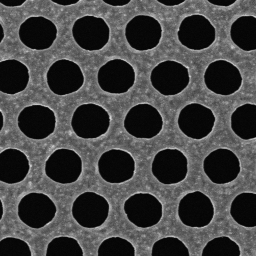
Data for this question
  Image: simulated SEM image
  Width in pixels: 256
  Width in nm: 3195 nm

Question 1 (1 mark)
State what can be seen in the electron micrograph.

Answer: a regular array of holes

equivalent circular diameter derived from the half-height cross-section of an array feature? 454 nanometres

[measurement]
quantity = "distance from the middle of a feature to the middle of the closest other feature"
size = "633 nm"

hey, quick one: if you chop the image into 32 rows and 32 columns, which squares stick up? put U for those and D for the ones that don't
DDDUUUUDDUUUUUDDUUUUDDUUUUUDDUUU
UUUUUUUUUUUUUUUUUUUUUUUUUUUUUUUU
UUUDDDUUUUDDDUUUDDDDUUUDDDUUUUDD
UUDDDDDUUDDDDDUUDDDDUUDDDDDUUDDD
DUDDDDDUUDDDDDUUDDDDUUDDDDDUUDDD
UUUDDDDUUUDDDUUUDDDDUUUDDDUUUDDD
UUUUUUUUUUUUUUUUUUUUUUUUUUUUUUUU
UDUUUUUDUUUUUUDUUUUUUUUUUUUDUUUU
DDDUUUDDDDUUUDDDDUUDDDDUUUDDDDUU
DDDDUUDDDDUUDDDDDUUDDDDDUUDDDDUU
DDDUUUDDDDUUDDDDDUUDDDDDUUDDDDUU
DDUUUUUDDUUUUUDDUUUUDDDUUUUDDUUU
UUUUUUUUUUUUUUUUUUUUUUUUUUUUUUUU
UUUDDDUUUUDDDUUUUDDUUUUDDDUUUUDD
UUDDDDDUUDDDDDUUDDDDUUDDDDDUUDDD
UUDDDDDUUDDDDDUDDDDDUUDDDDDUUDDD
UUUDDDUUUDDDDUUUDDDDUUUDDDUUUDDD
UUUUUUUUUUUUUUUUUUUUUUUUUUUUUUUU
UUUUUUUUUUUUUUUUUUUUUUUUUUUUUUUU
DDDUUUDDDDUUUDDDUUUDDDDUUUDDDDUU
DDDDUUDDDDUUDDDDDUUDDDDUUDDDDDUU
DDDDUUDDDDUUDDDDDUUDDDDUUUDDDDUU
DDDUUUDDDDUUUDDDUUUUDDDUUUDDDUUU
UUUUUUUUUUUUUUUUUUUUUUUUUUUUUUUU
UUUDDDUUUUDDDUUUDDDUUUUDDDUUUUDD
UUDDDDDUUDDDDDUUDDDDUUDDDDDUUDDD
UUDDDDDUUDDDDDUUDDDDUUDDDDDUUDDD
UUUDDDUUUDDDDUUUDDDDUUUDDDUUUDDD
UUUUDUUUUUUDUUUUUUUUUUUUUUUUUUUU
UUUUUUUUUUUUUUUUUUUUUUUUUUUUUUUU
DDDUUUDDDDUUUDDDDUUDDDDUUUDDDDUU
DDDDUUDDDDUUDDDDDUUDDDDDUDDDDDUU